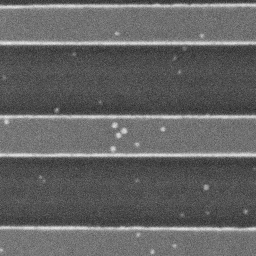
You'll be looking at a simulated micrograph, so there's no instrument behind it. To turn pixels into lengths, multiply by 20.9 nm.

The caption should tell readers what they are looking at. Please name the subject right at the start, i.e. lines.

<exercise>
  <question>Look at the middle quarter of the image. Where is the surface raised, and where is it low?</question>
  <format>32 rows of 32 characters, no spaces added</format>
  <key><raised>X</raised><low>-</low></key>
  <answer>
--------------------------------
--------------------------------
--------------------------------
--------------------------------
--------------------------------
--------------------------------
--------------------------------
--------------------------------
--------------------------------
--------------------------------
--------------------------------
--------------------------------
--------------------------------
XXXXXXXXXXXXXXXXXXXXXXXXXXXXXXXX
XXXXXXXXXXXXXXXXXXXXXXXXXXXXXXXX
XXXXXXXXXXXXXXXXXXXXXXXXXXXXXXXX
XXXXXXXXXXXXXXXXXXXXXXXXXXXXXXXX
XXXXXXXXXXXXXXXXXXXXXXXXXXXXXXXX
XXXXXXXXXXXXXXXXXXXXXXXXXXXXXXXX
XXXXXXXXXXXXXXXXXXXXXXXXXXXXXXXX
XXXXXXXXXXXXXXXXXXXXXXXXXXXXXXXX
XXXXXXXXXXXXXXXXXXXXXXXXXXXXXXXX
XXXXXXXXXXXXXXXXXXXXXXXXXXXXXXXX
--------------------------------
--------------------------------
--------------------------------
--------------------------------
--------------------------------
--------------------------------
--------------------------------
--------------------------------
--------------------------------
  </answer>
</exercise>